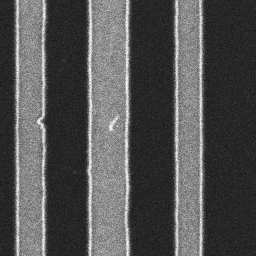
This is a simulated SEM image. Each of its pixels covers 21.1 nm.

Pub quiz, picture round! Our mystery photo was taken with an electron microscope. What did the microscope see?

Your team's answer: one or a few lines or trenches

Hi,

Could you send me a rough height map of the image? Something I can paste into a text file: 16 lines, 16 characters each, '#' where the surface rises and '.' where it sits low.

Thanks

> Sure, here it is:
#..###..###..###
#..###..###..###
#..###..###..###
#..###..###..###
#..###..###..###
#..###..###..###
#..###..###..###
#..###..###..###
#..###..###..###
#..###..###..###
#..###..###..###
#..###..###..###
#..###..###..###
#..###..###..###
#..###..###..###
#..###..###..###